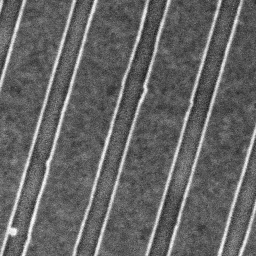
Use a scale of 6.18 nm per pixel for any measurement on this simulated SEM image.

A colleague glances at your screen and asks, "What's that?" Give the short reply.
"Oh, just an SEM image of one or a few lines or trenches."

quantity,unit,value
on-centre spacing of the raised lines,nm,432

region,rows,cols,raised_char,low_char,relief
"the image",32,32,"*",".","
...******...******...******...**
...******...******...******...**
..*******..*******..*******..***
..******...*******..*******..***
..******...******...******...***
.*******..*******...******...***
.******...*******..*******..****
.******...******...******...****
.******...******...******...****
*******..*******...******..*****
******...******...******...*****
******...******...******...*****
******..*******...******...*****
*****...*******..*******..******
*****...******...******...******
*****..*******...******...******
*****..*******..*******..*******
****...******...*******..*******
****...******...******...******.
****..*******...******...******.
***...*******..*******..*******.
***...******...******...******..
***...******...******...******..
***..*******..*******..*******..
**...******...*******..*******..
**...******...******...******...
**..*******..*******...******...
*...*******..*******..*******..*
*...******...******...******...*
*...******...******...******...*
*..*******..*******..*******...*
...******...******...*******..**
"